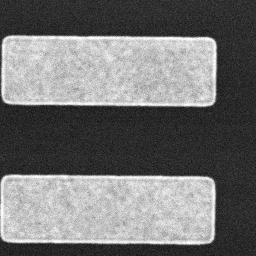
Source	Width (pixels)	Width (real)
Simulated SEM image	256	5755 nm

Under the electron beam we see wiring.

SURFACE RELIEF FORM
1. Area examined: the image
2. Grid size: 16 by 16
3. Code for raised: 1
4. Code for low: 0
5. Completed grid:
0000000000000000
0000000000000000
1111111111111000
1111111111111000
1111111111111000
1111111111111000
0000011111111000
0000000000000000
0000000000000000
0000000000000000
0000000000000000
1111111111111000
1111111111111000
1111111111111000
1111111111111000
0000000000000000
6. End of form